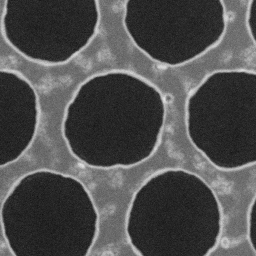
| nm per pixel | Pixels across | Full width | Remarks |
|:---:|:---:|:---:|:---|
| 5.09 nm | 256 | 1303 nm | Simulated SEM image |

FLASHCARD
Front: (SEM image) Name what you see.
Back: holes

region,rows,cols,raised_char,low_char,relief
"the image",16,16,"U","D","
DDDDDDUUDDDDDDUU
DDDDDDUUDDDDDDUU
UDDDDDUUDDDDDDUU
UUDDUUUUUDDDUUUU
DUUUUUUUUUUUUUDU
DDUUUDDDDDUUDDDD
DDUUDDDDDDUUDDDD
DDUUDDDDDDUUDDDD
DDUUDDDDDDUUDDDD
DUUUUDDDDUUUUDDD
UUUUUUUUUUUUUUUU
UDDDDUUUUDDDDUUU
DDDDDDUUDDDDDDUU
DDDDDDUUDDDDDDUU
DDDDDDUUDDDDDDUU
UDDDDDUUUDDDDUUU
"